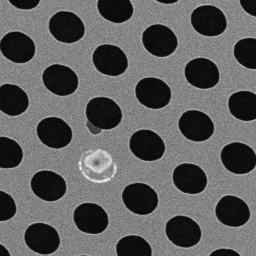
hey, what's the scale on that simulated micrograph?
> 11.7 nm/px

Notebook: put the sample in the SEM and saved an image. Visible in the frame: a regular array of holes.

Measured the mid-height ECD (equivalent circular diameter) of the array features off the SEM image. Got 33.2 px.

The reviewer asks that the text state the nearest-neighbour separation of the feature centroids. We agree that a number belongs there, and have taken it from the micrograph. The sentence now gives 621 nanometers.